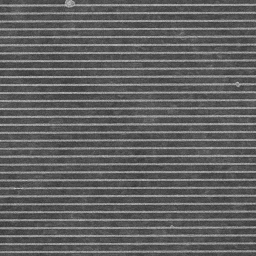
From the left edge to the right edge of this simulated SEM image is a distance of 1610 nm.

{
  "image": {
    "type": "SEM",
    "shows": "parallel lines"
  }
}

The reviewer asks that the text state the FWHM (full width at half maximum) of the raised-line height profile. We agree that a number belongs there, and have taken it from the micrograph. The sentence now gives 0.0086 micrometres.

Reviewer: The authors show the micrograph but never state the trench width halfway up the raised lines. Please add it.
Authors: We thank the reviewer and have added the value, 40.9 nm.